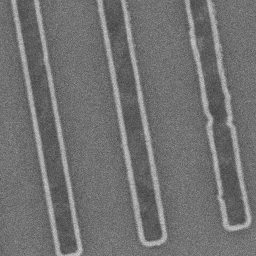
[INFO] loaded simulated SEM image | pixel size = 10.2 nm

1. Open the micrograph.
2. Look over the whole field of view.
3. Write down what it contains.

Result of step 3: one or a few lines or trenches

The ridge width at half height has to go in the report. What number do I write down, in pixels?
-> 22.7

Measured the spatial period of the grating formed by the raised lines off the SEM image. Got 874 nanometers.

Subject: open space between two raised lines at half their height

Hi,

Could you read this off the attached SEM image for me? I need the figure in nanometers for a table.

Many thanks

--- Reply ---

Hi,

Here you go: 639